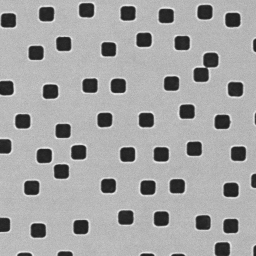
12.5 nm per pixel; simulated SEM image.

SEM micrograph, a regular array of holes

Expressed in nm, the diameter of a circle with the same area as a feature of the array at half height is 205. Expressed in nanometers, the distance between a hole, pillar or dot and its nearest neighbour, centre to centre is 412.